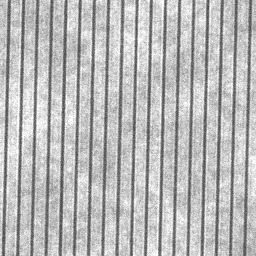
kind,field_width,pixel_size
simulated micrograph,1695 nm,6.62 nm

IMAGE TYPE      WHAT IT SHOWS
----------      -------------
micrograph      parallel lines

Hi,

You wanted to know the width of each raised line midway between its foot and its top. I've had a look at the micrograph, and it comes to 65.4 nm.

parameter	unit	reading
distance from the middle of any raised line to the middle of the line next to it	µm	0.0939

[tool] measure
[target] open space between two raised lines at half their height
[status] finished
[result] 24 nanometres